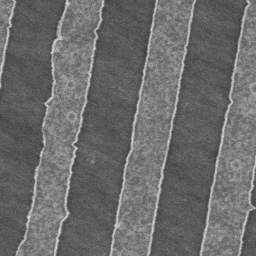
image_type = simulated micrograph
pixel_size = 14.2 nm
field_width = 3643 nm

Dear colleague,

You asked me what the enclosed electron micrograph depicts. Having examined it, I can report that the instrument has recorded one or a few lines or trenches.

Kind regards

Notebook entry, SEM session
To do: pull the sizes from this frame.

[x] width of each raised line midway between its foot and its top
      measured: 522 nanometres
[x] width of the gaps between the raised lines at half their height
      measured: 746 nanometers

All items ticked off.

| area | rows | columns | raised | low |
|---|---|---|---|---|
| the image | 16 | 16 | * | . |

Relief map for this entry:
*...**....**...*
*...**....**...*
....**...***...*
...***...***...*
...***...**....*
...**....**...**
...**....**...**
...**...***...**
...**...***...**
...**...**....**
..**....**....**
..**....**...***
..**....**...***
..**...***...**.
..**...***...**.
.***...**....**.